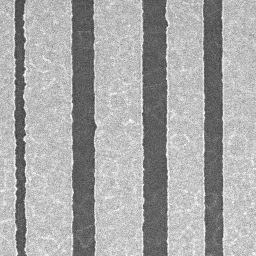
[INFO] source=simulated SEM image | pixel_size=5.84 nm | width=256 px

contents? one or a few lines or trenches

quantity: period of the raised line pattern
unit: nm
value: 400